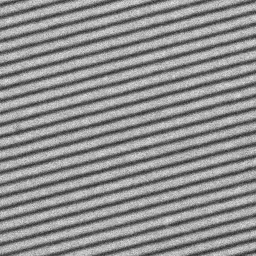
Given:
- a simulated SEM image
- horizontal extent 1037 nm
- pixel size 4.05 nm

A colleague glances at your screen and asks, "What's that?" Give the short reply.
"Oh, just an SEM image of parallel lines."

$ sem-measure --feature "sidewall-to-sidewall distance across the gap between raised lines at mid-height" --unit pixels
3.88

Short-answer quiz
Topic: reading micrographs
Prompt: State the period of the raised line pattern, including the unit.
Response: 47 nanometers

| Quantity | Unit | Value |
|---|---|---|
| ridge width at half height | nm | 31.4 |